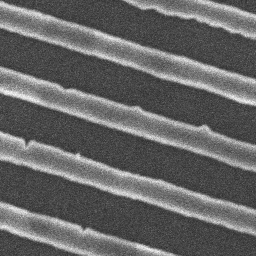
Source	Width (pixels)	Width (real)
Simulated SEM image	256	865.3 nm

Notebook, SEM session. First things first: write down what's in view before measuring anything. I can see one or a few lines or trenches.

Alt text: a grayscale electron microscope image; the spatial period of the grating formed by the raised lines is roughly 213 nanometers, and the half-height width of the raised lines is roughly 76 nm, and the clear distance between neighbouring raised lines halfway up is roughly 0.135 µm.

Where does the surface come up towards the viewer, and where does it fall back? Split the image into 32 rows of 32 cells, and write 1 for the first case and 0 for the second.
00000000000000000111111111100000
11110000000000000000111111111100
11111110000000000000000001111111
01111111110000000000000000001111
00001111111110000000000000000001
00000001111111111000000000000000
00000000001111111111000000000000
00000000000000111111111000000000
00000000000000000111111111100000
11100000000000000000111111111100
11111110000000000000000111111111
11111111110000000000000000011111
00001111111110000000000000000011
00000001111111111000000000000000
00000000001111111111000000000000
00000000000001111111111000000000
00000000000000001111111111000000
11100000000000000000111111111000
11111110000000000000000111111111
11111111110000000000000000111111
00011111111100000000000000000111
00000011111111100000000000000000
00000000011111111110000000000000
00000000000001111111110000000000
00000000000000001111111110000000
00000000000000000000111111111000
11100000000000000000001111111111
11111110000000000000000000111111
11111111110000000000000000000111
00011111111110000000000000000000
00000001111111111000000000000000
00000000011111111111000000000000